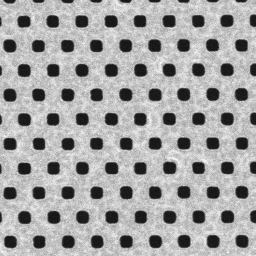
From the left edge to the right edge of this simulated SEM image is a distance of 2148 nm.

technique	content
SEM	a regular array of holes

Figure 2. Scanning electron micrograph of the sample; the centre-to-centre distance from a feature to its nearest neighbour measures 237 nanometres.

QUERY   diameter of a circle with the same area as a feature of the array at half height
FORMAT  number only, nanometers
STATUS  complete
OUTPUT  115